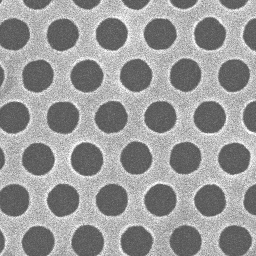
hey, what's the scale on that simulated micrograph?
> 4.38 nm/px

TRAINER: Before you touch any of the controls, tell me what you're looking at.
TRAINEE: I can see a regular array of holes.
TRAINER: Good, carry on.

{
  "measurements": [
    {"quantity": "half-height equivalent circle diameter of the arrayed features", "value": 0.142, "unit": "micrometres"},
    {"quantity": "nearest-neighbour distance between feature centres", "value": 47.8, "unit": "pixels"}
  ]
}